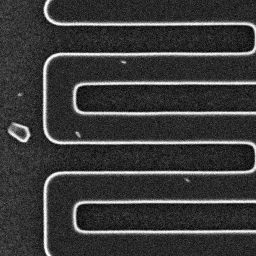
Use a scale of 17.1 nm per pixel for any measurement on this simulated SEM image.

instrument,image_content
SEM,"groups of lines, slits or small figures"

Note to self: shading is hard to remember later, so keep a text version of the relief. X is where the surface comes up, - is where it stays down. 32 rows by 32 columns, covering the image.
------XXXXXXXXXXXXXXXXXXXXXXXXXX
------XXXXXXXXXXXXXXXXXXXXXXXXXX
------XXXXXXXXXXXXXXXXXXXXXXXXXX
--------------------------------
--------------------------------
--------------------------------
-------------------------------X
------XXXXXXXXXXXXXXXXXXXXXXXXXX
------XXXXXXXXXXXXXXXXXXXXXXXXXX
------XXXXXXXXXXXXXXXXXXXXXXXXXX
------XXXXX---------------------
------XXX-----------------------
------XXX-----------------------
------XXXX----------------------
------XXXXXXXXXXXXXXXXXXXXXXXXXX
------XXXXXXXXXXXXXXXXXXXXXXXXXX
--X---XXXXXXXXXXXXXXXXXXXXXXXXXX
------XXXXXXXXXXXXXXXXXXXXXXXXXX
--------------------------------
--------------------------------
--------------------------------
-------------------------------X
------XXXXXXXXXXXXXXXXXXXXXXXXXX
------XXXXXXXXXXXXXXXXXXXXXXXXXX
------XXXXXXXXXXXXXXXXXXXXXXXXXX
------XXXX----------------------
------XXX-----------------------
------XXX-----------------------
------XXXX----------------------
------XXXXXXXXXXXXXXXXXXXXXXXXXX
------XXXXXXXXXXXXXXXXXXXXXXXXXX
------XXXXXXXXXXXXXXXXXXXXXXXXXX